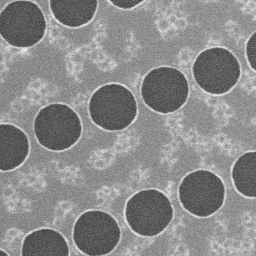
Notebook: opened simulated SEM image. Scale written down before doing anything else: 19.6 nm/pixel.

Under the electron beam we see holes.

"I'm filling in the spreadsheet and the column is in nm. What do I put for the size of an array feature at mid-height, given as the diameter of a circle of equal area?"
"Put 932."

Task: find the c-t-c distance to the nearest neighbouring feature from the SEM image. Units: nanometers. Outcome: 1090